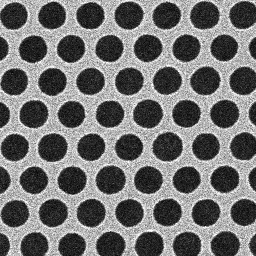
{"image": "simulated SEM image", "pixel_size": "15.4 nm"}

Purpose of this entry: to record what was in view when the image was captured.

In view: a regular array of holes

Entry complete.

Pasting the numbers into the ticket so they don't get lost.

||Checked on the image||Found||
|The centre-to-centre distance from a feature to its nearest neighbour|581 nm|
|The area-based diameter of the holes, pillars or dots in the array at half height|445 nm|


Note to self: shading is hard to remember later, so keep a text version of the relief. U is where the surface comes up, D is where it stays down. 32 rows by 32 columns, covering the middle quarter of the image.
UUUUUUUUUUUUUUUUUUUUUUUUUUDUUUUU
UUUUUDDDDUUUUUDDDDDUUUUUDDDDUUUU
UUUUDDDDDDUUUDDDDDDDUUUDDDDDDUUU
DUUDDDDDDDUUUDDDDDDDUUDDDDDDDDUU
DUUDDDDDDDUUUDDDDDDDUUDDDDDDDDUD
DUUDDDDDDDUUUDDDDDDDUUDDDDDDDUUU
UUUUDDDDDUUUUDDDDDDUUUUDDDDDUUUU
UUUUUDDDUUUUUUDDDDUUUUUUDDDUUUUU
UUUUUUUUUUUUUUUUUUUUUUUUUUUUUUUU
UDDDUUUUUDDDDDUUUUUDDDDUUUUUDDDD
DDDDDUUUDDDDDDDUUUDDDDDDUUUUDDDD
DDDDDUUUDDDDDDDUUDDDDDDDDUUDDDDD
DDDDDUUUDDDDDDDUUDDDDDDDDUUDDDDD
DDDDDUUUDDDDDDDUUDDDDDDDDUUDDDDD
DDDDDUUUDDDDDDUUUUDDDDDDUUUUDDDD
DDDDUUUUUDDDDUUUUUUDDDDUUUUUDDDD
UUUUUUUUUUUUUUUUUUUUUUUUUUUUUUUU
UUUUUUDDUUUUUUUDDDUUUUUUDDDDUUUU
UUUUDDDDDDUUUUDDDDDUUUUDDDDDDUUU
DUUUDDDDDDUUUDDDDDDDUUDDDDDDDDUU
DUUDDDDDDDUUUDDDDDDDUUDDDDDDDDUU
DUUDDDDDDDUUUDDDDDDDUUDDDDDDDDUU
DUUUDDDDDDUUUDDDDDDUUUDDDDDDDUUU
UUUUDDDDDUUUUUDDDDUUUUUDDDDDUUUU
UUUUUUUUUUUUUUUUUUUUUUUUUDUUUUUU
UUUUUUUUUUUDDUUUUUUUDDUUUUUUUUDD
DDDDDUUUUDDDDDDUUUDDDDDDUUUUDDDD
DDDDDDUUDDDDDDDUUUDDDDDDDUUDDDDD
DDDDDDUUDDDDDDDDUDDDDDDDDUUDDDDD
DDDDDDUUDDDDDDDUUDDDDDDDDUUDDDDD
DDDDDUUUDDDDDDDUUUDDDDDDDUUDDDDD
DDDDDUUUUDDDDDDUUUDDDDDDUUUUDDDD